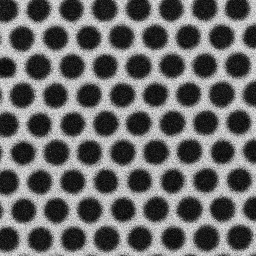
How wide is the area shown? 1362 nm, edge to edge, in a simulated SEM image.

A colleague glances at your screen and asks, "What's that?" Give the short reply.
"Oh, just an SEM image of a regular array of holes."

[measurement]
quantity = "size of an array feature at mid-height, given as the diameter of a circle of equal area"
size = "134 nm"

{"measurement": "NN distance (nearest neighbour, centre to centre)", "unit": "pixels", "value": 32.8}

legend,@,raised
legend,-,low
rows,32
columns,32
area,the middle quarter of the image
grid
-----@@------@@-------@@------@@
-----@@------@@-------@@------@@
----@@@@-----@@@-----@@@-----@@@
@--@@@@@@--@@@@@@---@@@@@@@@@@@@
@@@@@@@@@@@@@@@@@@@@@@@@@@@@@@@-
@@@@----@@@@-----@@@@----@@@@---
-@@------@@@------@@------@@----
-@@------@@@------@@------@@----
-@@------@@@------@@------@@----
-@@------@@@-----@@@-----@@@----
@@@@----@@@@@---@@@@@@--@@@@@@--
@@@@@@@@@@@@@@@@@@@@@@@@@@@@@@@@
@---@@@@-----@@@@----@@@@-----@@
-----@@@-----@@@------@@------@@
-----@@-------@-------@@------@@
-----@@-------@-------@@------@@
-----@@------@@@-----@@@------@@
----@@@@----@@@@@---@@@@@----@@@
@@@@@@@@@@@@@@@@@@@@@@@@@@@@@@@@
@@@@@---@@@@@----@@@@----@@@@---
-@@@-----@@@-----@@@------@@----
-@@------@@@------@@------@@----
-@@------@@-------@@------@@----
-@@@-----@@@------@@------@@@---
@@@@----@@@@@----@@@@----@@@@---
@@@@@@@@@@@@@@@@@@@@@@@@@@@@@@@@
@--@@@@@@--@@@@@@@---@@@@@---@@@
-----@@@-----@@@------@@@-----@@
-----@@@-----@@@------@@------@@
-----@@-------@@------@@------@@
-----@@@-----@@@------@@------@@
-----@@@-----@@@@----@@@@----@@@